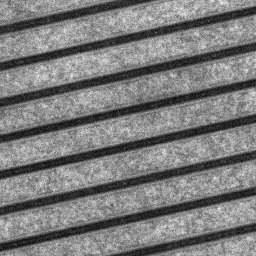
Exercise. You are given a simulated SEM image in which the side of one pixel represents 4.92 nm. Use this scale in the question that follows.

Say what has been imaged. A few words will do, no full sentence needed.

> parallel lines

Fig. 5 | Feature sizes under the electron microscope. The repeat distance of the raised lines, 174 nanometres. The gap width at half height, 0.0481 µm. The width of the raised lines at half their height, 124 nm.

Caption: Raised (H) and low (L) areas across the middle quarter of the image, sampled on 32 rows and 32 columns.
HHHHHHHHHHHHHHHHHHHHLLLLLLLLLLLL
HHHHHHHHHHHHHHHHLLLLLLLLLLLHHHHH
HHHHHHHHHHHLLLLLLLLLLLLHHHHHHHHH
HHHHHHHLLLLLLLLLLLHHHHHHHHHHHHHH
HHLLLLLLLLLLLLHHHHHHHHHHHHHHHHHH
LLLLLLLLLHHHHHHHHHHHHHHHHHHHHHHH
LLLLLHHHHHHHHHHHHHHHHHHHHHHHHHHH
HHHHHHHHHHHHHHHHHHHHHHHHHHHHHLLL
HHHHHHHHHHHHHHHHHHHHHHHHLLLLLLLL
HHHHHHHHHHHHHHHHHHHHLLLLLLLLLLLL
HHHHHHHHHHHHHHHHLLLLLLLLLLLHHHHH
HHHHHHHHHHHLLLLLLLLLLLHHHHHHHHHH
HHHHHHHLLLLLLLLLLLHHHHHHHHHHHHHH
HHLLLLLLLLLLLHHHHHHHHHHHHHHHHHHH
LLLLLLLLLHHHHHHHHHHHHHHHHHHHHHHH
LLLLHHHHHHHHHHHHHHHHHHHHHHHHHHHH
HHHHHHHHHHHHHHHHHHHHHHHHHHHHHHLL
HHHHHHHHHHHHHHHHHHHHHHHHLLLLLLLL
HHHHHHHHHHHHHHHHHHHHLLLLLLLLLLLH
HHHHHHHHHHHHHHHLLLLLLLLLLLLHHHHH
HHHHHHHHHHHLLLLLLLLLLLLHHHHHHHHH
HHHHHHHLLLLLLLLLLLLHHHHHHHHHHHHH
HHLLLLLLLLLLLLHHHHHHHHHHHHHHHHHH
LLLLLLLLLLHHHHHHHHHHHHHHHHHHHHHH
LLLLLHHHHHHHHHHHHHHHHHHHHHHHHHHH
LHHHHHHHHHHHHHHHHHHHHHHHHHHHHHLL
HHHHHHHHHHHHHHHHHHHHHHHHHLLLLLLL
HHHHHHHHHHHHHHHHHHHHLLLLLLLLLLLL
HHHHHHHHHHHHHHHHLLLLLLLLLLLLHHHH
HHHHHHHHHHHLLLLLLLLLLLLHHHHHHHHH
HHHHHHHLLLLLLLLLLLLHHHHHHHHHHHHH
HHLLLLLLLLLLLLHHHHHHHHHHHHHHHHHH